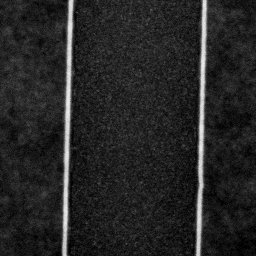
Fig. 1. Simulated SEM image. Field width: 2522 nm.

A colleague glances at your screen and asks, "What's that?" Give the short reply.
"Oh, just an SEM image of one or a few lines or trenches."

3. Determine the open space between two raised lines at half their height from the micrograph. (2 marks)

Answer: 1320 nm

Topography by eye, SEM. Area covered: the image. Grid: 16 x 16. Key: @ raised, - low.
@@@@---------@@@
@@@@---------@@@
@@@@---------@@@
@@@@---------@@@
@@@@---------@@@
@@@@---------@@@
@@@@---------@@@
@@@@---------@@@
@@@@---------@@@
@@@@---------@@@
@@@@---------@@@
@@@@---------@@@
@@@@--------@@@@
@@@@--------@@@@
@@@@--------@@@@
@@@@--------@@@@